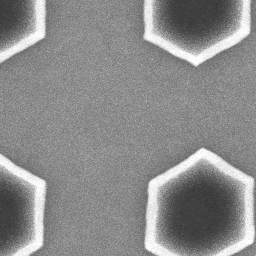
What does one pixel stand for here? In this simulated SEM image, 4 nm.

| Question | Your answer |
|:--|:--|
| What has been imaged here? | raised bodies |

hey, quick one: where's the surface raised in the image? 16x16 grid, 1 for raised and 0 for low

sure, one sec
1110000001111110
1110000001111110
1100000000111110
0000000000001000
0000000000000000
0000000000000000
0000000000000000
0000000000000000
0000000000000000
0000000000000000
1000000000011100
1100000000111111
1110000001111111
1100000001111111
1100000001111111
1100000000111110